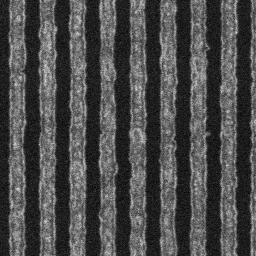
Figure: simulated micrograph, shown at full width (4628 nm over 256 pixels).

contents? parallel lines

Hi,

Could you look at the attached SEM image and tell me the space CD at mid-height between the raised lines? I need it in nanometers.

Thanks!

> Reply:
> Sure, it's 235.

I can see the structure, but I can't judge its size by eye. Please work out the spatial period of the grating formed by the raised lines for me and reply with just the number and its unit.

546 nanometres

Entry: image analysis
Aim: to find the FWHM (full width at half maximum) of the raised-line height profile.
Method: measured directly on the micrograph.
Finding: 319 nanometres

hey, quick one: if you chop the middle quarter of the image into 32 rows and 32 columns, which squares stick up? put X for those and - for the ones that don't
XX---XXXX---XXXXX---XXXX----XXXX
XX---XXXX---XXXXX---XXXXX---XXXX
XX---XXXX----XXXX---XXXXX---XXXX
XX---XXXX----XXXX---XXXX----XXXX
XX---XXXX---XXXXX---XXXXX---XXXX
XX---XXXX---XXXXX---XXXXX---XXXX
XX---XXXXX--XXXXX---XXXX----XXXX
XX---XXXXX--XXXXX---XXXX----XXXX
XX---XXXXX--XXXXX---XXXX----XXXX
XX---XXXX---XXXXX---XXXX---XXXXX
X----XXXX----XXXX---XXXXX--XXXXX
XX---XXXX----XXXX---XXXX----XXXX
XX---XXXX----XXXX---XXXX----XXXX
XX---XXXX----XXXX---XXXX----XXXX
XX---XXXX----XXXX---XXXX---XXXXX
XX---XXXX----XXXX---XXXX---XXXXX
X----XXXXX---XXXX---XXXXX---XXXX
XX---XXXXX--XXXXX---XXXX----XXXX
XX---XXXX---XXXXX---XXXXX--XXXXX
XX---XXXX---XXXXX---XXXXX---XXXX
X----XXXX---XXXXX---XXXX----XXXX
X----XXXX----XXXX---XXXXX---XXXX
XX---XXXX----XXXX---XXXX----XXXX
XX---XXXX----XXX----XXXX----XXXX
XX---XXXX----XXXX---XXXX----XXXX
XX---XXXX----XXXX---XXXX----XXXX
XX---XXXX----XXXX---XXXXX---XXXX
XX---XXXX----XXXX---XXXXX---XXXX
X----XXXX---XXXXX---XXXX----XXXX
XX---XXXX---XXXXX---XXXX----XXXX
XX---XXXX---XXXXX---XXXX----XXXX
XX---XXXX---XXXXX---XXXXX---XXXX